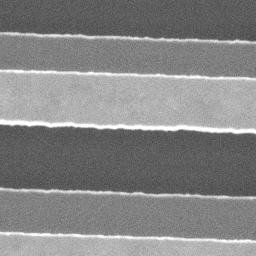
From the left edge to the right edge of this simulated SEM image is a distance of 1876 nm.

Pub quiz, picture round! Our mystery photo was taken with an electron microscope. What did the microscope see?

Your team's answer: lines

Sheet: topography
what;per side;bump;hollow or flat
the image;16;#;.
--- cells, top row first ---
................
................
#############...
################
################
################
################
################
................
................
................
................
################
################
################
################